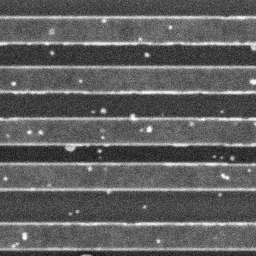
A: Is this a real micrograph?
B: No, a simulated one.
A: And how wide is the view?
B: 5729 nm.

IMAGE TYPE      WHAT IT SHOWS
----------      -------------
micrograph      lines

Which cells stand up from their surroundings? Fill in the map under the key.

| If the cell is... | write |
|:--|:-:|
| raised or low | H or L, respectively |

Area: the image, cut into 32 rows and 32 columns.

LLLLLLLLLLLLLLLLLLLLLLLLLLLLLLLL
LLLLLLLLLLLLLLLLLLLLLLLLLLLLLLLL
HHHHHHHHHHHHHHHHHHHHHHHHHHHHHHHH
HHHHHHHHHHHHHHHHHHHHHHHHHHHHHHHH
HHHHHHHHHHHHHHHHHHHHHHHHHHHHHHHH
HLLHLHLLHLHHHHHHHLHHHHHHHHHHHHHH
LLLLLLLLLLLLLLLLLLLLLLLLLLLLLLLL
LLLLLLLLLLLLLLLLLLLLLLLLLLLLLLLL
HHHHHHHHHHHHHHHHHHHHHHHHHHHHHHHH
HHHHHHHHHHHHHHHHHHHHHHHHHHHHHHHH
HHHHHHHHHHHHHHHHHHHHHHHHHHHHHHHH
LHHHHHLLHLHHHHHHHHHHHHHHHHHHHHHH
LLLLLLLLLLLLLLLLLLLLLLLLLLLLLLLL
LLLLLLLLLLLLLLLLLLLLLLLLLLLLLLLL
LLLLLLLLLLLLLLLLLLLLLLLLLLLLLLLL
HHHHHHHHHHHHHHHHHHHHHHHHHHHHHHHH
HHHHHHHHHHHHHHHHHHHHHHHHHHHHHHHH
HHHHHHHHHHHHHHHHHHHHHHHHHHHHHHHH
LLLLLLLLLLLLLLLLLLLLLLLLLLLLLLLL
LLLLLLLLLLLLLLLLLLLLLLLLLLLLLLLL
HHHHHHHHHHHHHHHHHHHHHHHHHHHHHLLL
HHHHHHHHHHHHHHHHHHHHHHHHHHHHHHHH
HHHHHHHHHHHHHHHHHHHHHHHHHHHHHHHH
HHHHHHHHHHHHHHHHHHHHHHHHHHHHHHHH
LLLLLLLLLLLLLLLLLLLLLLLLLLLLLLLL
LLLLLLLLLLLLLLLLLLLLLLLLLLLLLLLL
LLLLLLLLLLLLLLLLLLLLLLLLLLLLLLLL
LLLLLLLLLLLLLLLLLLLLLLLLLLLLLLLL
HHHHHHHHHHHHHHHHHHHHHHHHHHHHHHHH
HHHHHHHHHHHHHHHHHHHHHHHHHHHHHHHH
HHHHHHHHHHHHHHHHHHHHHHHHHHHHHHHH
LLLLLLLLLLLLLLLLLLLLLLLLLLLLLLLL